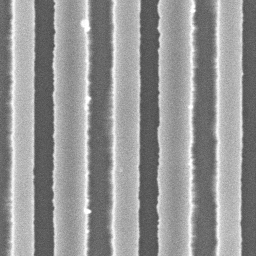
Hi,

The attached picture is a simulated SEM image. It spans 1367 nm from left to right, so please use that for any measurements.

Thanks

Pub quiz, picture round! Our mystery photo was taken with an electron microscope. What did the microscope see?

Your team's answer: lines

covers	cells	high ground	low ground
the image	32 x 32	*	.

..**...****...***...****...***..
..**...****...***...****...***..
..**...****...***...****...***..
.***...****...***...****...***..
.***...****...***...****...***..
.***...****...***...****...***..
.***...****...***...****...***..
.***...****...***...****...***..
.***...****...***...****...***..
.***...****...***...****...***..
..**...****...***...****...***..
.***...****...***...****...***..
.***...****...***...****...***..
.***...****...***...****...***..
.***...****...***...****...***..
.***...****...***...****...***..
.***...****...***...****...***..
.***...****...***...****...***..
.***...****...***...****...***..
..**...****...***...****...***..
..**...****...***...****...***..
.***...****...***...****...***..
.***...****...***...****...***..
.***...****...***...****...***..
.***...****...***...****...***..
.***...****...***...****...***..
.***...****...***...****...***..
.***...****...***...****...***..
.***...****...***...****...***..
.***...****...***...****...***..
.***...****...***...****...***..
.***...****...***...****...***..